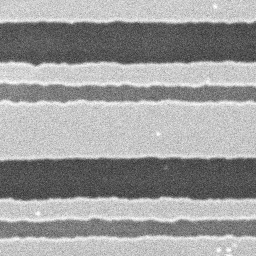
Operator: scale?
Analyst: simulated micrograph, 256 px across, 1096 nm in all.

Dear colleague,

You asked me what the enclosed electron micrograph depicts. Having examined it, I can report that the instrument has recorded lines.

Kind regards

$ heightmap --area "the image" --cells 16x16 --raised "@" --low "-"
@@@@@@@@@@@@@@@@
----------------
----------------
----------------
@@@@@@@@@@@@@@@@
@@@@@@@@@@@@@@@@
@@@@@@@@@@@@@@@@
@@@@@@@@@@@@@@@@
@@@@@@@@@@@@@@@@
@@@@@@@@@@@@@@@@
----------------
----------------
@--@@@@@@@@@--@@
@@@@@@@@@@@@@@@@
@@@@@@@@@@@@@@@@
@@@@@@@@@@@@@@@@